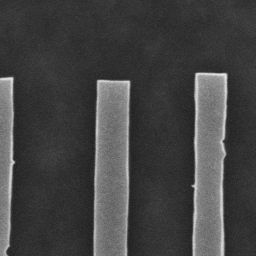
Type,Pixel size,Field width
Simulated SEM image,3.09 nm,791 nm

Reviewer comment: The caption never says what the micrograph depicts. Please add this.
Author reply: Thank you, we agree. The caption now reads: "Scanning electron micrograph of one or a few lines or trenches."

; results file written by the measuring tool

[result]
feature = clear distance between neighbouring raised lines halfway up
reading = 234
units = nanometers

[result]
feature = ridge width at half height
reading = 30.8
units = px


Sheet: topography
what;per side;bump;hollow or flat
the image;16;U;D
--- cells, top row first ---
DDDDDDDDDDDDDDDD
DDDDDDDDDDDDDDDD
DDDDDDDDDDDDDDDD
DDDDDDDDDDDDDDDD
DDDDDDDDDDDDDDDD
UDDDDDUUDDDDUUDD
UDDDDDUUDDDDUUDD
UDDDDDUUDDDDUUDD
UDDDDDUUDDDDUUDD
UDDDDDUUDDDDUUDD
UDDDDDUUDDDDUUDD
UDDDDDUUDDDDUUDD
UDDDDDUUDDDDUUDD
UDDDDDUUDDDDUUDD
UDDDDDUUDDDDUUDD
DDDDDDUUDDDDUUDD